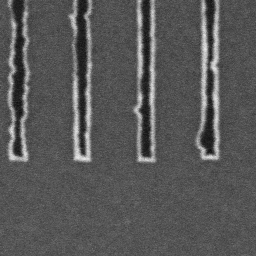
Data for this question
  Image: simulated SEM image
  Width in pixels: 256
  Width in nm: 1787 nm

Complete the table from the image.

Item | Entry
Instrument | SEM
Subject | one or a few lines or trenches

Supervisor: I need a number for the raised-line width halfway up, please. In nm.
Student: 110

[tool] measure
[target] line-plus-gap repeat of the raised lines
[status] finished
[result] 63.8 px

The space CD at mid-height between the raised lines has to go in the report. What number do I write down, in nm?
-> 337